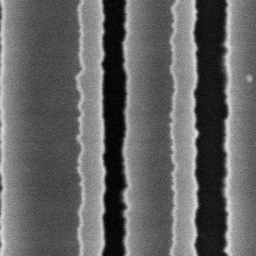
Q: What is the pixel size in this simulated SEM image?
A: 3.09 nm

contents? lines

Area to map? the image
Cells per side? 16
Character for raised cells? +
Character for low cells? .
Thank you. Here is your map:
++++++..++++..++
++++++..++++..++
++++++..++++..++
++++++..++++..++
++++++..++++..++
++++++..++++..++
++++++..++++..++
++++++..++++..++
++++++..++++..++
++++++..++++..++
+++++++.++++..++
+++++++.++++..++
++++++..++++..++
++++++..++++..++
++++++..++++..++
++++++..++++..++